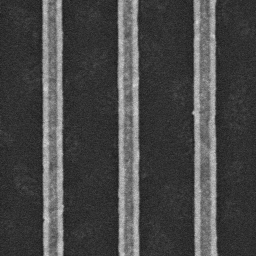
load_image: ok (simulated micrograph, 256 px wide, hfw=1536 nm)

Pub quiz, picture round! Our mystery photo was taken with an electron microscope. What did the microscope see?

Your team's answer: one or a few lines or trenches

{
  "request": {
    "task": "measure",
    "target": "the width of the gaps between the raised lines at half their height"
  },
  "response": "365 nm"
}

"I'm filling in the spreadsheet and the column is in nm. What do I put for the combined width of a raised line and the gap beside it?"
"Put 456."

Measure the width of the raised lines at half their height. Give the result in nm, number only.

86.9